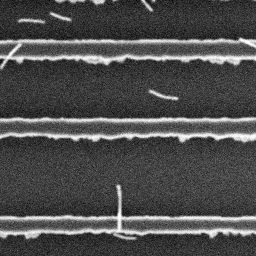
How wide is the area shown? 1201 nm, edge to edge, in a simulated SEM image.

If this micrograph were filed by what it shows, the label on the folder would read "lines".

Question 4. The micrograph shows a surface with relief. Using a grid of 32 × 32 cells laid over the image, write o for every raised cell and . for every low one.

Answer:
................................
................................
................................
................................
................................
oooooooooooooooooooooooooooooooo
oooooooooooooooooooooooooooooooo
................................
................................
................................
................................
................................
................................
................................
................................
oooooooooooooooooooooooooooooooo
oooooooooooooooooooooooooooooooo
................................
................................
................................
................................
................................
................................
................................
................................
................................
................................
oooooooooooooooooooooooooooooooo
oooooooooooooooooooooooooooooooo
................................
................................
................................